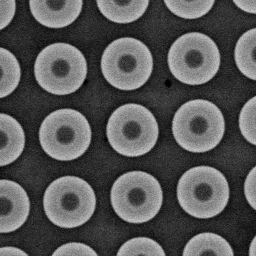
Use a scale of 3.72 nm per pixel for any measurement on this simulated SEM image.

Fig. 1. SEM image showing an array of small figures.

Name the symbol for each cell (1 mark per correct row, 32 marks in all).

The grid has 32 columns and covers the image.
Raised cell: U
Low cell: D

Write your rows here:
UUDDUUUUUUDDUUUUUUDDDUUUUUUDDUUU
UUDDUUUUUUDDDUUUUUDDDDUUUUDDDDDU
UDDDDUUUUDDDDDUUUDDDDDDDDDDDDDDD
DDDDDDDDDDDDDDDDDDDDDDDDDDDDDDDD
DDDDDDDDDDDDDDDDDDDDDDDUUUDDDDUU
DDDDDDDUDDDDDDUUUUDDDDUUUUUDDDUU
UDDDDUUUUUDDDUUUUUUDDUUUUUUDDUUU
UUDDDUUUUUUDDUUUUUUDDUUUUUUDDUUU
UUDDUUUUUUUDDUUUUUUDDUUUUUUDDDUU
UUUDUUUUUUUDDUUUUUUDDDUUUUUDDDDU
UUDDDUUUUUDDDDUUUUDDDDDUUDDDDDDD
UDDDDDUUUDDDDDDDDDDDDDDDDDDDDDDD
DDDDDDDDDDDDDDDDDDDDDDDDUDDDDDDU
DDDDDDDDDDDDDDDUUUDDDDUUUUUDDDUU
UDDDDDUUUUDDDDUUUUUDDDUUUUUUDDUU
UUDDDUUUUUUDDUUUUUUUDDUUUUUUDDUU
UUUDDUUUUUUDDUUUUUUUDDUUUUUUDDUU
UUUDDUUUUUUDDDUUUUUUDDUUUUUUDDDU
UUUDDUUUUUUDDDUUUUUDDDDUUUUDDDDD
UUDDDDUUUUDDDDDDUDDDDDDDDDDDDDDD
UDDDDDDDDDDDDDDDDDDDDDDDDDDDDDDD
DDDDDDDDDDDDDDDDUUDDDDDUUUUDDDDU
DDDDDDDUUUDDDDDUUUUDDDUUUUUUDDDU
UUUDDDUUUUUDDDUUUUUUDDUUUUUUUDDU
UUUDDDUUUUUUDDUUUUUUDDUUUUUUUDDU
UUUUDUUUUUUUDDUUUUUUDDDUUUUUDDDU
UUUUDDUUUUUUDDUUUUUUDDDUUUUUDDDD
UUUDDDUUUUUDDDDDUUUDDDDDDDDDDDDD
UUDDDDDDDDDDDDDDDDDDDDDDDDDDDDDD
DDDDDDDDDDDDDDDDDDDDDDDDUUUDDDDD
DDDDDDDDUUDDDDDDUUUUDDDUUUUUUDDU
UUUDDDDUUUUUDDDUUUUUDDDUUUUUUDDU